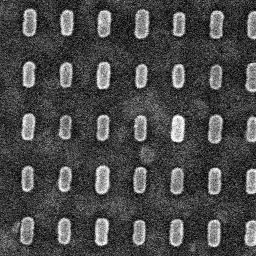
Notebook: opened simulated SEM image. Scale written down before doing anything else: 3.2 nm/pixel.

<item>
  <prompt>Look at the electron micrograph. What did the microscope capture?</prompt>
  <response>a regular array of raised bodies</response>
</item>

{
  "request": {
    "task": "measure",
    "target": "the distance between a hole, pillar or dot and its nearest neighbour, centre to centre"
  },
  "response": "119 nm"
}